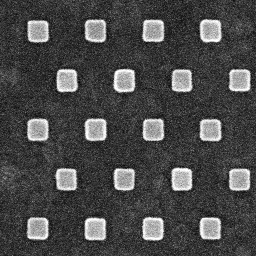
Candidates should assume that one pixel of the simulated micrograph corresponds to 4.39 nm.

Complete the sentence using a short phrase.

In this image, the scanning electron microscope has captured a regular array of raised bodies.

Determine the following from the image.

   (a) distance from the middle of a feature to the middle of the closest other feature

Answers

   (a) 250 nanometres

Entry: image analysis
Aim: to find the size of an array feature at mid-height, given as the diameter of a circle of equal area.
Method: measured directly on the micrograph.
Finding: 0.098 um